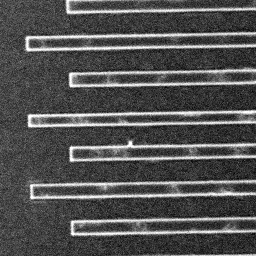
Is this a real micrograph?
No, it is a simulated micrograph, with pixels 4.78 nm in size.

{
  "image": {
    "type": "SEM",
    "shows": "parallel lines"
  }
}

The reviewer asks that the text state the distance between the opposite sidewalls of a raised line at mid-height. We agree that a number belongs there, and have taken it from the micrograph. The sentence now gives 63.3 nanometers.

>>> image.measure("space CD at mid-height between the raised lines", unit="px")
22.9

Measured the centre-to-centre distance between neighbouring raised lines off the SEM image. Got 37 pixels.